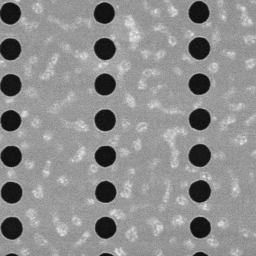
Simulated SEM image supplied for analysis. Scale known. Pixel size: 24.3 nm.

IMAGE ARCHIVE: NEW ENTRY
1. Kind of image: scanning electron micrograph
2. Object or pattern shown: a regular array of holes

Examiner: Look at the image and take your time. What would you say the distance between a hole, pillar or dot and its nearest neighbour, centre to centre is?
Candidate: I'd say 0.87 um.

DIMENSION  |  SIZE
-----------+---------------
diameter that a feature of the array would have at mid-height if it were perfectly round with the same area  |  539 nanometers